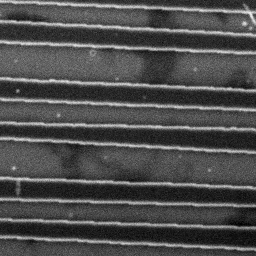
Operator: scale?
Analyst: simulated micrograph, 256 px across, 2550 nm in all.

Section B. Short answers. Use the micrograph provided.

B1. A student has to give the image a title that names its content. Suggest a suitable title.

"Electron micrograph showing lines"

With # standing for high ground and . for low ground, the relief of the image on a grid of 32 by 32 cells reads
.......#########################
..............................##
................................
#################...............
################################
..##############################
...........................#####
................................
................................
................................
##################..............
################################
################################
.........................#######
................................
######..........................
################################
...#############################
....................############
................................
................................
................................
#########.......................
################################
################################
...................#############
................................
##..............................
################################
################################
..................##############
................................